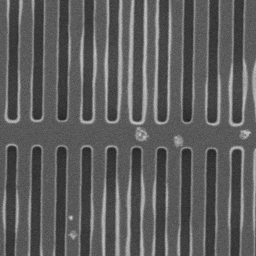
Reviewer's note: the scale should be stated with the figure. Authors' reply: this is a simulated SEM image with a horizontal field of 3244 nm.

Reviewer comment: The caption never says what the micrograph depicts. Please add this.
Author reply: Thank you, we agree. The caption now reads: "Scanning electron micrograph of groups of lines, slits or small figures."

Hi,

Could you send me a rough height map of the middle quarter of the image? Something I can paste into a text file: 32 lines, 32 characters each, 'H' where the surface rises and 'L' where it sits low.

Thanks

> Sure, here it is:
LHHHLLLLHHHLLLHHHLLLHHHLLLHHHHLL
LHHHLLLLHHHLLLHHHLLLHHHLLLHHHHLL
LHHHLLLLHHHLLLHHHLLLHHHLLLHHHHLL
LHHHLLLLHHHLLLHHHLLLHHHLLLHHHHLL
LHHHHLLLHHHLLLHHHLLLHHHLLLHHHLLL
LHHHHLLHHHHLLLHHHLLLHHHLLLHHHLLL
LHHHLLLLHHHLLLHHHLLLHHHLLLHHHLLL
LHHHLLLLHHHLLLHHHLLLHHHLLLHHHLLL
LHHHHLLHHHHLLLHHHLLLHHHLLLHHHLLL
LHHHLLLHHHHLLLHHHLLLHHHLLLHHHLLL
LHHHLLLLHHHLLLHHHLLLHHHLLLHHHLLL
LHHHLLLLHHHLLLHHHLLLHHHLLLHHHLLL
LHHHLLLLHHHLLLHHHLLLHHHLLLHHHLLL
LHHHLLLHHHHLLLHHHLLLHHHLLLHHHLLL
HHHHHLLHHHHHLHHHHLLHHHHLLHHHHHLH
HHHHHHHHHHHHHHHHHHHHHHHHHHHHHHHH
HHHHHHHHHHHHHHHHHHHHHHHHHHHHHHHH
HHHHHHHHHHHHHHHHHHHHHHHHHHHHHHHH
HHHHHHHHHHHHHHHHHHHHHHHHHHHHHHHH
HHHHHHHHHHHHHHHHHHHHHHHHHHHHHHHH
HHHHHHHHHHHHHHHHHHHHHHHHHHHHHHHH
LHHHHLLHHHHLLHHHHLLHHHHLLHHHHHLL
LHHHLLLHHHHLLHHHHLLHHHHLLLHHHLLL
LHHHLLLHHHHLLHHHHLLHHHHLLLHHHLLL
LHHHLLLHHHHLLHHHHLLHHHHLLLHHHLLL
LHHHLLLHHHHLLHHHHLLHHHHLLLHHHLLL
LHHHLLLHHHHLLHHHHLLHHHHLLLHHHLLL
LHHHLLLHHHLLLHHHHLLHHHHLLLHHHLLL
LHHHLLLHHHLLLHHHHLLHHHHLLLHHHLLL
LHHHLLLHHHLLLHHHHLLHHHHLLLHHHLLL
LHHHLLLHHHLLLHHHHLLLHHHLLLHHHLLL
LHHHLLLHHHLLLHHHLLLLHHHLLLHHHLLL